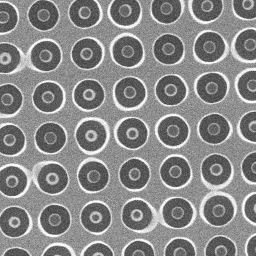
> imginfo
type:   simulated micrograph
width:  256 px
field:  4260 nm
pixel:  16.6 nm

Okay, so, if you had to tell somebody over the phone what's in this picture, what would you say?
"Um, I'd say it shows an array of small figures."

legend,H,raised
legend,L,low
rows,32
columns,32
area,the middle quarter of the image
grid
HHHLLLLLHHHHHHLLLLHHHHHHHHHHHHHH
HHHHHHHHHHHHHHHHHHHHHHHHHHHHHHHH
HHHHHHHHHHHHHHHHHHHHHHHHHHHHHHHH
HHHHHHHHHHHHHHHLLLHHHHHHHLLLLHHH
HHHHLLLLHHHHHHLLLLLLHHHLLLLLLLHH
HHHLLLLLLHHHHLLLLLLLHHHLLLHHLLHH
HHHLLLLLLLHHLLLHHHLLLHHLLHHHLLLH
HHLLLHHLLLHHLLLHHHLLLHHLLLHHLLLH
HHLLLHHLLLHHHLLLLLLLHHHLLLLLLLHH
HHHLLLLLLLHHHLLLLLLLHHHHLLLLLHHH
HHHHLLLLLHHHHHLLLLLHHHHHHHHHHHHH
HHHHHLLHHHHHHHHHHHHHHHHHHHHHHHHH
HHHHHHHHHHHHHHHHHHHHHHHHHHHHHHHH
HHHHHHHHHHHHHHHHLLHHHHHHHLLLLHHH
HHHHLLLLLLHHHHLLLLLLHHHHLLLLLLHH
HHHHLLLLLLLHHLLLLLLLLHHLLLLHLLLH
HHHLLLLLLLLHHLLLHHLLLHHLLLHHHLLH
LHHLLLHHLLLHHLLLHHLLLHHLLLHHHLLH
LHHLLLHHLLLHHLLLHHLLLHHHLLLLLLLH
HHHLLLLLLLLHHHLLLLLLHHHHLLLLLLHH
HHHHLLLLLLHHHHHLLLLHHHHHHHLLLHHH
HHHHHLLLLHHHHHHHHHHHHHHHHHHHHHHH
HHHHHHHHHHHHHHHHHHHHHHHHHHHHHHHH
HHHHHHHHHHHHHHHHHLHHHHHHHHLLLLHH
HHHHHLLLLHHHHHHLLLLLHHHHHLLLLLLH
HHHHLLLLLLHHHHLLLLLLLHHHLLLLLLLH
HHHHLLLLLLLHHHLLLHHLLHHHLLHHHLLL
LHHLLLHHHLLHHHLLHHHLLLHHLLLHHLLL
LHHLLLHHHLLHHHLLLHHLLHHHLLLLLLLL
LHHHLLLLLLLHHHLLLLLLLHHHHLLLLLLH
LHHHLLLLLLHHHHHLLLLLHHHHHHLLLLHH
HHHHHLLLLHHHHHHHHLLHHHHHHHHHHHHH